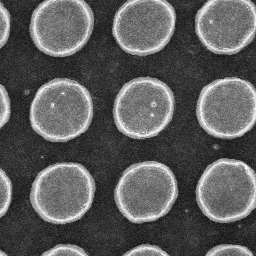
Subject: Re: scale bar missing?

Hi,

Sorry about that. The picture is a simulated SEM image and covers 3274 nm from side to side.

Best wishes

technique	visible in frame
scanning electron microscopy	raised bodies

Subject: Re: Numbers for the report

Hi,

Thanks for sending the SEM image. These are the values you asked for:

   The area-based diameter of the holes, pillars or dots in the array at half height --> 754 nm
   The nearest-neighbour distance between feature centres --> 1050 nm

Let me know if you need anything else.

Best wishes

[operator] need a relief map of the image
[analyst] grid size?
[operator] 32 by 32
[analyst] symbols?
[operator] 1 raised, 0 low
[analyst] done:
00000111110000001111100000111110
10000111111000011111110001111111
10001111111000111111110001111111
10001111111000111111110001111111
10001111111000111111100001111110
00000111110000011111100000111110
00000011100000000110000000000000
00000000000000000000000000000000
00000000000000000000000000000000
00000000000000000000000000000000
00000011100000001111000000011110
00000111111000011111100001111111
10001111111000011111100001111111
10001111111000111111100001111111
10001111111000111111100001111111
00001111111000011111100001111111
00000111110000001111000000111110
00000000000000000000000000000000
00000000000000000000000000000000
00000000000000000000000000000000
00000000000000000011000000011110
00000111111000001111100000111111
10000111111000011111110001111111
10001111111100011111110001111111
10001111111000011111110001111111
10001111111000011111100001111111
00000111110000011111100000111110
00000011100000000110000000011000
00000000000000000000000000000000
00000000000000000000000000000000
00000000000000000000000000000000
00000011110000001111000000111110